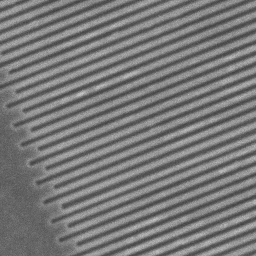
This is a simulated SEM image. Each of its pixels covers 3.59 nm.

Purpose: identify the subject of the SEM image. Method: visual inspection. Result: parallel lines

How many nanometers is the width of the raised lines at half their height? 17.9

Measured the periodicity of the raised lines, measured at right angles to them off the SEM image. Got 36.8 nanometers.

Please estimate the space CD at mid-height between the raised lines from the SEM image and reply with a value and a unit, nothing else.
17.5 nanometers